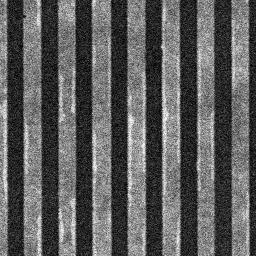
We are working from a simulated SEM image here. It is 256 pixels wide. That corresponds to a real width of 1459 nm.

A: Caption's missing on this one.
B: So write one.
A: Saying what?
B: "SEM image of parallel lines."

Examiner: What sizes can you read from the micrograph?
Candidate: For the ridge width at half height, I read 101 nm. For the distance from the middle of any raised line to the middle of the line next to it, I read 0.197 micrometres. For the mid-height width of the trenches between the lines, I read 96.2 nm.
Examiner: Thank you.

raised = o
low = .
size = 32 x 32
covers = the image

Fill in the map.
o..oo..oo...oo..oo..oo...oo..oo.
o..oo..oo...oo..oo..oo...oo..oo.
o..oo..oo...oo..oo..oo...oo..oo.
o..oo..oo...oo..oo..oo...oo..oo.
o..oo..oo...oo..oo..oo...oo..oo.
o..oo..oo...oo..oo..oo...oo..oo.
o..oo..oo...oo..oo..oo...oo..oo.
o..oo..oo...oo..oo..ooo..oo..oo.
o..oo..oo...oo..oo..ooo..oo..oo.
o..oo..oo...oo..oo..ooo..oo..oo.
o..oo..oo...oo..oo..ooo..oo..oo.
o..oo..oo...oo..oo..ooo..oo..oo.
o..oo..oo...oo..oo..ooo..oo..oo.
o..oo..oo...oo..oo..oo...oo..oo.
o..oo..oo...oo..oo..oo...oo..oo.
o..oo..oo...oo..oo..oo...oo..oo.
o..oo..oo...oo..oo..oo...oo..oo.
o..oo..oo...oo..oo..oo...oo..oo.
o..oo..oo...oo..oo..oo...oo..oo.
o..oo..oo...oo..oo..oo...oo..oo.
o..oo..oo...oo..oo..oo...oo..oo.
o..oo..oo...oo..oo..oo...oo..oo.
o..oo..oo...oo..oo..oo...oo..oo.
o..oo..oo...oo..oo..ooo..oo..oo.
o..oo..oo...oo..oo..oo...oo..oo.
o..oo..oo...oo..oo..oo...oo..oo.
o..oo..oo...oo..oo..oo...oo..oo.
o..oo..oo...oo..oo..oo...oo..oo.
o..oo..oo...oo..oo..oo...oo..oo.
o..oo..oo...oo..oo..oo...oo..oo.
o..oo..oo...oo..oo..oo...oo..oo.
o..oo..oo...oo..oo..oo...oo..oo.